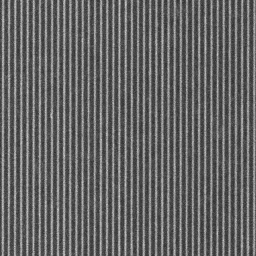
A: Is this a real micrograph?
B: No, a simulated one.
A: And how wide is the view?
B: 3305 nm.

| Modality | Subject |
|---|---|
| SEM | parallel lines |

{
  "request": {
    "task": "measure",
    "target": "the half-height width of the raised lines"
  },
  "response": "19.4 nm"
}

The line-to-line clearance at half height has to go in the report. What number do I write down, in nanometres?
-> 61.3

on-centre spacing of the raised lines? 79.1 nm